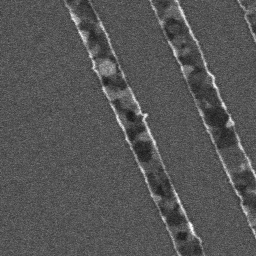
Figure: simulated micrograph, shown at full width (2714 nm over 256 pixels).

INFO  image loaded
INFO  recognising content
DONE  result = one or a few lines or trenches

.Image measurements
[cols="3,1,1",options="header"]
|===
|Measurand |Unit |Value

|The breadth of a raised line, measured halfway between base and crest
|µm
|0.247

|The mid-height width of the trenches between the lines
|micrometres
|0.577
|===